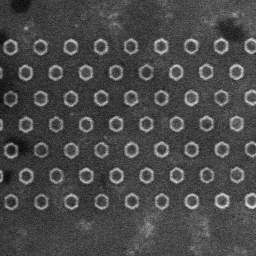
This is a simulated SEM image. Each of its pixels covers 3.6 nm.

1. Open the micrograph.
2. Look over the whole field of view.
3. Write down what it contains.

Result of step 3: a regular array of raised bodies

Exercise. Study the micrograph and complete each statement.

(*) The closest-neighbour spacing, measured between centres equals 107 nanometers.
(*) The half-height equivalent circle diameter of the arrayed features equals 49.3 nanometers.